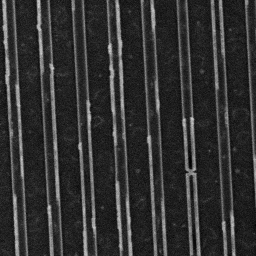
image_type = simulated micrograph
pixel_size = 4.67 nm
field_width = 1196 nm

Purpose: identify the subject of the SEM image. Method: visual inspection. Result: parallel lines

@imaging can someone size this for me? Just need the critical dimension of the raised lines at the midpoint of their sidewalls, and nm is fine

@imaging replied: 57.7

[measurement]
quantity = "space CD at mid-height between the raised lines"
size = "106 nm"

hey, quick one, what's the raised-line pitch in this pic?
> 162 nanometers